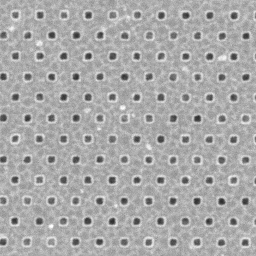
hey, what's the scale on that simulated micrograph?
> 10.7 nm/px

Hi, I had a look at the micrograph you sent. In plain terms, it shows a regular array of holes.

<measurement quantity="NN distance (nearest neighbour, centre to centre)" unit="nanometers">252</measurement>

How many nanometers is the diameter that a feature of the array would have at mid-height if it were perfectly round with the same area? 96.4